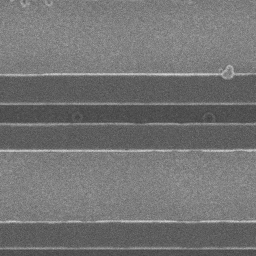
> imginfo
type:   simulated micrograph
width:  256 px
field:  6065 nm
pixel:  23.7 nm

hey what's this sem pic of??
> lines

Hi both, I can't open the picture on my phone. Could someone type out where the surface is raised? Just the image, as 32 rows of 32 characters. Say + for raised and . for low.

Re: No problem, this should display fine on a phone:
................................
................................
................................
................................
................................
................................
................................
................................
............................+...
++++++++++++++++++++++++++++++++
++++++++++++++++++++++++++++++++
++++++++++++++++++++++++++++++++
++++++++++++++++++++++++++++++++
................................
................................
+++++++++++++++++.++++++++++++++
++++++++++++++++++++++++++++++++
++++++++++++++++++++++++++++++++
++++++++++++++++++++++++++++++++
................................
................................
................................
................................
................................
................................
................................
................................
................................
++++++++++++++++++++++++++++++++
++++++++++++++++++++++++++++++++
++++++++++++++++++++++++++++++++
................................